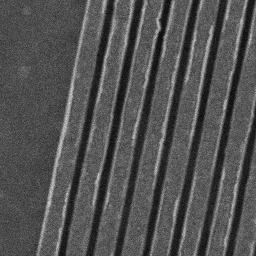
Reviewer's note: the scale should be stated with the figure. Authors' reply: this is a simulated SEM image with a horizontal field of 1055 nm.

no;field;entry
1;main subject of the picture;parallel lines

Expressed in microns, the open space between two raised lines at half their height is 0.0354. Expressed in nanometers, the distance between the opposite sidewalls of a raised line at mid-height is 77.8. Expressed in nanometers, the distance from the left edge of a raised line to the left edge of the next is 113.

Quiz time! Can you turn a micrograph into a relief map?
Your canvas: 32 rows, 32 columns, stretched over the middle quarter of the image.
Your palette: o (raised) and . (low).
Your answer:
...ooooo..oooo...ooooo..oooo...o
...oooo...oooo...oooo...oooo...o
...oooo...oooo...oooo..ooooo...o
..ooooo..ooooo..ooooo..ooooo..oo
..ooooo..ooooo..ooooo..ooooo..oo
..ooooo..ooooo..ooooo..ooooo..oo
..oooo...oooo...oooo...oooo...oo
..oooo...oooo...oooo...oooo...oo
.ooooo..ooooo..ooooo..ooooo..ooo
.ooooo..ooooo..ooooo..ooooo..ooo
.oooo...ooooo..ooooo..ooooo..ooo
.oooo...oooo...oooo...oooo...ooo
.oooo...oooo...oooo...oooo...ooo
ooooo..ooooo..ooooo..ooooo..oooo
ooooo..ooooo..ooooo..ooooo..oooo
ooooo..ooooo..oooo...ooooo..oooo
oooo...oooo...oooo...oooo...oooo
oooo...oooo...oooo...oooo...oooo
oooo..ooooo..ooooo..ooooo...oooo
oooo..ooooo..ooooo..ooooo..ooooo
oooo..ooooo..oooo...ooooo..ooooo
ooo...ooooo..oooo...ooooo..ooooo
ooo...ooooo..oooo...oooo...oooo.
ooo..ooooo..ooooo..ooooo..ooooo.
ooo..ooooo..ooooo..ooooo..ooooo.
ooo..ooooo..ooooo..oooo...ooooo.
ooo..ooooo..ooooo..oooo...oooo..
oo..ooooo...oooo...oooo...oooo..
oo..ooooo...oooo..ooooo..ooooo..
oo..ooooo..ooooo..ooooo..ooooo..
oo..ooooo..ooooo..ooooo..ooooo..
oo..oooo...ooooo..ooooo..oooo...